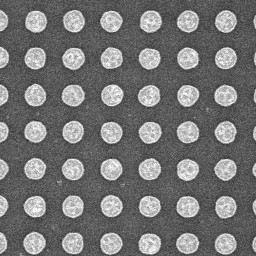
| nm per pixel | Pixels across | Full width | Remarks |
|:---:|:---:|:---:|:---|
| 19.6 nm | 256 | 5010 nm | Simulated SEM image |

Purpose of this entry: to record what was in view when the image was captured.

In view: a regular array of raised bodies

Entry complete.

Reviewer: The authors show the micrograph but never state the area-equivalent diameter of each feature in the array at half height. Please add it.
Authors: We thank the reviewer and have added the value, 417 nm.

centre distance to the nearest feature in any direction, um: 0.722